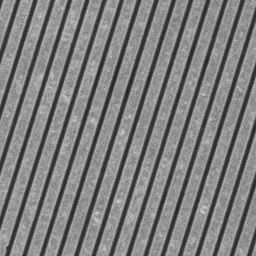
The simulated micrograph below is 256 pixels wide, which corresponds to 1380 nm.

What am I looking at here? parallel lines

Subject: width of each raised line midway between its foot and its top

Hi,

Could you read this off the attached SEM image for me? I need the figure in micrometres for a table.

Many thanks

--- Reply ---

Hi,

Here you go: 0.0643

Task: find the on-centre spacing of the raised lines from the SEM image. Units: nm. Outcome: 89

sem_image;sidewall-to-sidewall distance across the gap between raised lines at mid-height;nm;25.1